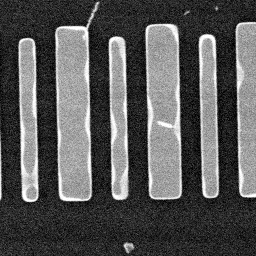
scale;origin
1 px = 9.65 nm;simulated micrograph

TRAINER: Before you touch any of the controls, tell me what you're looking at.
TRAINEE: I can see groups of lines, slits or small figures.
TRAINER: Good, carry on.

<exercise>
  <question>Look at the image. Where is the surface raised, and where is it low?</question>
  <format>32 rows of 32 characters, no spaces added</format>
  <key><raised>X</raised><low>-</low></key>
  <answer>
--------------------------------
--------------------------------
--------------------------------
-------XX---------XXXX--------XX
-------XXXX-------XXXX--------XX
--XX---XXXX---X---XXXX---XX---XX
--XX---XXXX---X---XXXX---XX---XX
--XX---XXXX---XX--XXXX---XX---XX
--XX---XXXX---XX--XXXX---XX---XX
--XX---XXXX---XX--XXXX---XX---XX
---X---XXXX---XX--XXXX---XX---XX
---X---XXXX---XX--XXXX---XX---XX
---X---XXXX---XX--XXXX---XX---XX
---X---XXXX---XX---XXX---XX---XX
---X---XXXX---XX---XXX---XX---XX
---XX--XXXX---XX---XXX---XX---XX
---XX--XXXX---XX---XXX---XX---XX
---XX--XXXX---XX---XXX---XX---XX
---XX--XXXX---XX---XXXX--XX---XX
---XX--XXXX---XX---XXXX--XX---XX
---XX--XXXX---XX---XXXX--XX---XX
---XX--XXXX---XX---XXXX--XX---XX
---XX--XXXX---XX---XXXX--XX---XX
---XX---XXX---XX---XXXX---X---XX
---XX---XXX---X----XXX----X-----
--------------------------------
--------------------------------
--------------------------------
--------------------------------
--------------------------------
--------------------------------
--------------------------------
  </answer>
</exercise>